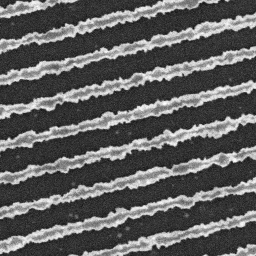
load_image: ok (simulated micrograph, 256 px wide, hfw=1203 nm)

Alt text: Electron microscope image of parallel lines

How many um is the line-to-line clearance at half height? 0.113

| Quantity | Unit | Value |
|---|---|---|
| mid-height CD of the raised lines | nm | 38.8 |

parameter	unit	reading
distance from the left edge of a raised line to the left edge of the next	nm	152